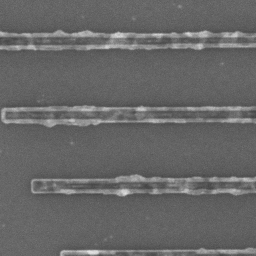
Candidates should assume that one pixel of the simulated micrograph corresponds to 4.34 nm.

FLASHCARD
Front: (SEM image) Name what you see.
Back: one or a few lines or trenches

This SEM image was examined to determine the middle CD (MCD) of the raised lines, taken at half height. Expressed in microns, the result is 0.0665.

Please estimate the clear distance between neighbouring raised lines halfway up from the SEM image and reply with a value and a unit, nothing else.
248 nm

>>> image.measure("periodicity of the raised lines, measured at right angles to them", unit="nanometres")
316